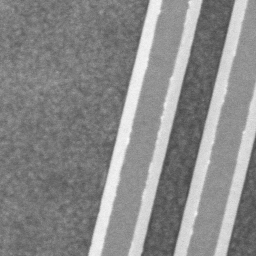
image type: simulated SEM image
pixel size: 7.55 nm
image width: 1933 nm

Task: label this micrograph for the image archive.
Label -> one or a few lines or trenches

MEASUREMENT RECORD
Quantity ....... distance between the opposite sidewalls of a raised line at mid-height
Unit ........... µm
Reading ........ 0.298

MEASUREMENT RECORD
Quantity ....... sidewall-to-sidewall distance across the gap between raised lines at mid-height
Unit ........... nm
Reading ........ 330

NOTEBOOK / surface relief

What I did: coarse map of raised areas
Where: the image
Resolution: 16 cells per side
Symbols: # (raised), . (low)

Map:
..........##...#
.........###...#
.........###..##
.........##...##
.........##...##
........###...##
........###...##
........##...###
........##...###
.......###...##.
.......###..###.
.......##...###.
.......##...###.
......###...##..
......###...##..
......###..###..